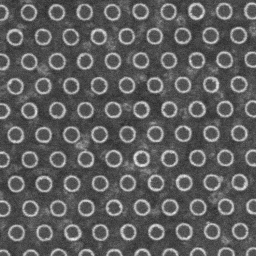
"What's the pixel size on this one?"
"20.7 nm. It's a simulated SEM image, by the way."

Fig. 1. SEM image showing a regular array of raised bodies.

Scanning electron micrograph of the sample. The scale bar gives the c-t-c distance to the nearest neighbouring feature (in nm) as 576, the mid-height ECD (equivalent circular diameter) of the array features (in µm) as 0.316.